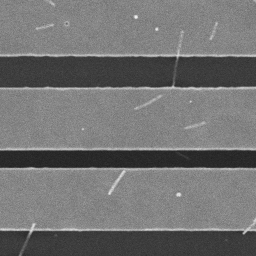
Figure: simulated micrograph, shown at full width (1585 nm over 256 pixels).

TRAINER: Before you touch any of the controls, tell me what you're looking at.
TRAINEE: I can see lines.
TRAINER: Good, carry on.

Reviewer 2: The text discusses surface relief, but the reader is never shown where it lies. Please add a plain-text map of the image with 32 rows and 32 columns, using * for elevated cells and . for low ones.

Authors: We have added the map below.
********************************
********************************
********************************
********************************
********************************
********************************
********************************
................................
................................
................................
................................
********************************
********************************
********************************
********************************
********************************
********************************
********************************
********************************
................................
................................
********************************
********************************
********************************
********************************
********************************
********************************
********************************
********************************
................................
................................
................................